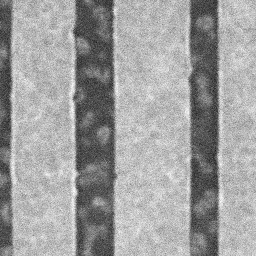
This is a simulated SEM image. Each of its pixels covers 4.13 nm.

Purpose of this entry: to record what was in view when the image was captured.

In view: one or a few lines or trenches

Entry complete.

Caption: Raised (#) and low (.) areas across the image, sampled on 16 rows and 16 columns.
.####..#####..##
.####..#####..##
.####..#####..##
.####..#####..##
.####..#####..##
.####..#####..##
.####..#####..##
.####..#####..##
.####..#####..##
.####..#####..##
.####..#####..##
.####..#####..##
.####..#####..##
.####..#####..##
.####..#####..##
.####..#####..##